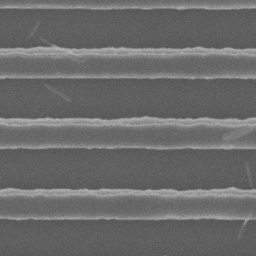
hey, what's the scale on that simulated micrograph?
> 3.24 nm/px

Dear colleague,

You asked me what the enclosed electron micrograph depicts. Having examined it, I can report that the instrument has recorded lines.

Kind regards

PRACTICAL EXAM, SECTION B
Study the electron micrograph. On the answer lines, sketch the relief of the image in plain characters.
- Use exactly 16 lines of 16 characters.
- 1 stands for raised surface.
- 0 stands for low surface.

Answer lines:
0000011001111110
0000000000000000
0000000000000000
1111111111111111
1111111111111111
0000000000000000
0000000000000000
1111111111111111
1111111111111111
0000000000000000
0000000000000000
0000000000000000
1111111111111111
1111111111111111
0000000000000000
0000000000000000